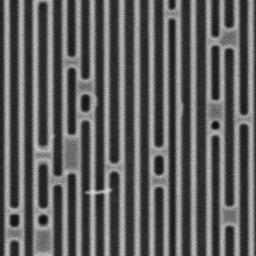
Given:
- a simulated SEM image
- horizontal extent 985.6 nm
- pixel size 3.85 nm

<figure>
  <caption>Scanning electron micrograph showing parallel lines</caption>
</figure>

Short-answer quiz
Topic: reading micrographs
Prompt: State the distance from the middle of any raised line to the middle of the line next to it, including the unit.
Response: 55.2 nm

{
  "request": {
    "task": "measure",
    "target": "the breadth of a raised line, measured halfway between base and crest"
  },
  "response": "0.0197 micrometres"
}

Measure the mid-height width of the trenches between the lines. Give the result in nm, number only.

36.1